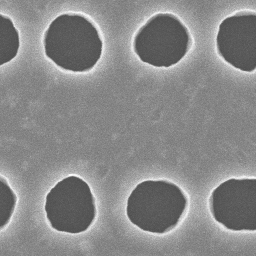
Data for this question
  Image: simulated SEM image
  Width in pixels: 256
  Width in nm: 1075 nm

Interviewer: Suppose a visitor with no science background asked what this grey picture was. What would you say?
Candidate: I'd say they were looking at holes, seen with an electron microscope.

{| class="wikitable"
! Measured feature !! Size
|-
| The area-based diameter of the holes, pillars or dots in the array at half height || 228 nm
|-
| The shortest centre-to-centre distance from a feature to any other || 0.366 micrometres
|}